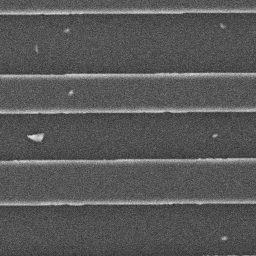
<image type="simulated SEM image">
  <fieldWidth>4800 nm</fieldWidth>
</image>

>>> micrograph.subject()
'lines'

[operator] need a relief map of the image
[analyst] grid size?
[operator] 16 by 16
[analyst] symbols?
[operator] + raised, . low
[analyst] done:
++++++++++++++++
................
................
................
................
++++++++++++++++
++++++++++++++++
................
................
................
++++++++++++++++
++++++++++++++++
++++++++++++++++
................
................
................